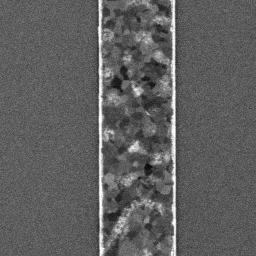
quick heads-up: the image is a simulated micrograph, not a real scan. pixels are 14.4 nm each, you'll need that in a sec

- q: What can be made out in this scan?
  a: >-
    one or a few lines or trenches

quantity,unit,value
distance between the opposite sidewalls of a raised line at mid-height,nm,1070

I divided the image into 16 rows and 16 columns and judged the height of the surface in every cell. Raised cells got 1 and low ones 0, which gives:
0000001111100000
0000001111100000
0000001111100000
0000001111100000
0000001111100000
0000001111100000
0000001111100000
0000001111100000
0000001111100000
0000001111100000
0000001111100000
0000001111100000
0000001111100000
0000001111100000
0000001111100000
0000001111100000